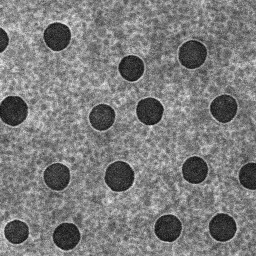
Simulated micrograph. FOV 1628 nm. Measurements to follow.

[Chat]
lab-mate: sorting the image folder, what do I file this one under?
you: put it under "a regular array of holes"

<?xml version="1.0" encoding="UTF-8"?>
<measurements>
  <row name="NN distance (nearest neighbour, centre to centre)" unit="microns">0.347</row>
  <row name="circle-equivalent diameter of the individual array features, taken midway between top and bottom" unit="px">28.2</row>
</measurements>